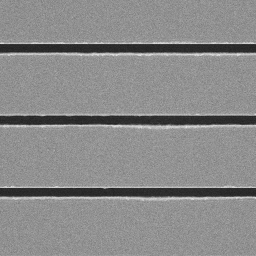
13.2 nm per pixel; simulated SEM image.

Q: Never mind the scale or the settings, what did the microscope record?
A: lines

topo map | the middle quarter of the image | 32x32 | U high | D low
UUUUUUUUUUUUUUUUUUUUUUUUUUUUUUUU
UUUUUUUUUUUUUUUUUUUUUUUUUUUUUUUU
UUUUUUUUUUUUUUUUUUUUUUUUUUUUUUUU
UUUUUUUUUUUUUUUUUUUUUUUUUUUUUUUU
UUUUUUUUUUUUUUUUUUUUUUUUUUUUUUUU
UUUUUUUUUUUUUUUUUUUUUUUUUUUUUUUU
UUUUUUUUUUUUUUUUUUUUUUUUUUUUUUUU
UUUUUUUUUUUUUUUUUUUUUUUUUUUUUUUU
UUUUUUUUUUUUUUUUUUUUUUUUUUUUUUUU
UUUUUUUUUUUUUUUUUUUUUUUUUUUUUUUU
UUUUUUUUUUUUUUUUUUUUUUUUUUUUUUUU
UUUUUUUUUUUUUUUUUUUUUUUUUUUUUUUU
UUUUUUUUUUUUUUUUUUUUUUUUUUUUUUUU
DDDDDDDDDDDDDDDDDDDDDDDDDDDDDDDD
DDDDDDDDDDDDDDDDDDDDDDDDDDDDDDDD
UUUUUUUUUUUUUUUUUUUUUUUUUUUUUUUU
UUUUUUUUUUUUUUUUUUUUUUUUUUUUUUUU
UUUUUUUUUUUUUUUUUUUUUUUUUUUUUUUU
UUUUUUUUUUUUUUUUUUUUUUUUUUUUUUUU
UUUUUUUUUUUUUUUUUUUUUUUUUUUUUUUU
UUUUUUUUUUUUUUUUUUUUUUUUUUUUUUUU
UUUUUUUUUUUUUUUUUUUUUUUUUUUUUUUU
UUUUUUUUUUUUUUUUUUUUUUUUUUUUUUUU
UUUUUUUUUUUUUUUUUUUUUUUUUUUUUUUU
UUUUUUUUUUUUUUUUUUUUUUUUUUUUUUUU
UUUUUUUUUUUUUUUUUUUUUUUUUUUUUUUU
UUUUUUUUUUUUUUUUUUUUUUUUUUUUUUUU
UUUUUUUUUUUUUUUUUUUUUUUUUUUUUUUU
UUUUUUUUUUUUUUUUUUUUUUUUUUUUUUUU
UUUUUUUUUUUUUUUUUUUUUUUUUUUUUUUU
UUUUUUUUUUUUUUUUUUUUUUUUUUUUUUUU
DDDDDDDDDDDDDDDDDDDDDDDDDDDDDDDD